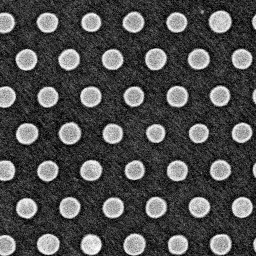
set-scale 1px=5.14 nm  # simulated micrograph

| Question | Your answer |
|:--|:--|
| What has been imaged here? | a regular array of raised bodies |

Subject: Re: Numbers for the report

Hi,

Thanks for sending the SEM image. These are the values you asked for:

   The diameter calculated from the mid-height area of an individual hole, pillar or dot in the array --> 0.106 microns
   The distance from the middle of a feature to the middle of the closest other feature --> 218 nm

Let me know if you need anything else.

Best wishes